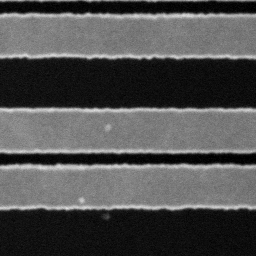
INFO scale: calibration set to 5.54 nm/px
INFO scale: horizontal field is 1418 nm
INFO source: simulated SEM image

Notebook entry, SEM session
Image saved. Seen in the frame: lines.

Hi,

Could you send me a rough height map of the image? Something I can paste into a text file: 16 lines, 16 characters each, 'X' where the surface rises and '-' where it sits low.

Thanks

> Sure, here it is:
----------------
XXXXXXXXXXXXXXXX
XXXXXXXXXXXXXXXX
XXXXXXXXXXXXXXXX
----------------
----------------
----------------
XXXXXXXXXXXXXXXX
XXXXXXXXXXXXXXXX
XXXXXXXXXXXXXXXX
XXXXXXXXXXXXXXXX
XXXXXXXXXXXXXXXX
XXXXXXXXXXXXXXXX
----------------
----------------
----------------